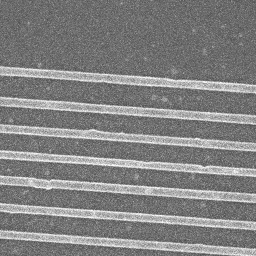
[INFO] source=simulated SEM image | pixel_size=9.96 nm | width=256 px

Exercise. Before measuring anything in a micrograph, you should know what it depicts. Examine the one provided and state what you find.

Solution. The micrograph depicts parallel lines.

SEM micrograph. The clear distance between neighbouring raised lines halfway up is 191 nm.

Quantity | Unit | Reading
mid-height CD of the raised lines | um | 0.0733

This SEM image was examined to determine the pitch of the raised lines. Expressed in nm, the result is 271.